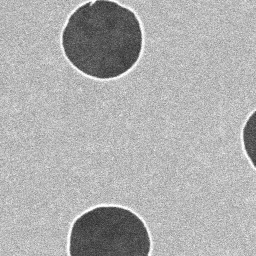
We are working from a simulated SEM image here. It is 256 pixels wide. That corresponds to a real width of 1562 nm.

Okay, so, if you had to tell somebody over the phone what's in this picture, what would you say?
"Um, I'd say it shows holes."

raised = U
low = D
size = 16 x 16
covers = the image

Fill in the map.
UUUUUDDDUUUUUUUU
UUUUDDDDDUUUUUUU
UUUUDDDDDUUUUUUU
UUUUDDDDDUUUUUUU
UUUUUDDDUUUUUUUU
UUUUUUUUUUUUUUUU
UUUUUUUUUUUUUUUU
UUUUUUUUUUUUUUUU
UUUUUUUUUUUUUUUD
UUUUUUUUUUUUUUUD
UUUUUUUUUUUUUUUU
UUUUUUUUUUUUUUUU
UUUUUUUUUUUUUUUU
UUUUUDDDDUUUUUUU
UUUUDDDDDUUUUUUU
UUUUDDDDDUUUUUUU